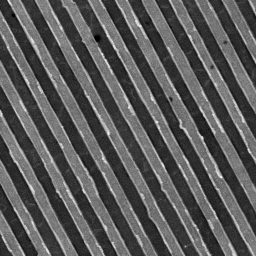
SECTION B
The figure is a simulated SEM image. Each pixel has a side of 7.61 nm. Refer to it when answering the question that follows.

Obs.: parallel lines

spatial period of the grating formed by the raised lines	179	nm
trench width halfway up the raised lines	101	nm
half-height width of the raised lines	10.5	px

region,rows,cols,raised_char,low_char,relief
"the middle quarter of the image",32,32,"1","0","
00111000111000011100001110001110
00111000011100001110001110000111
00011100011100001110000111000111
00011100001110000111000111000011
00001110001110000111000011100011
10001110000111000011100011100001
10000111000111100011100001110001
11000111000011100001110001110000
11000011100001110001110000111000
11100001100001110000111000011000
11100001110000111000011000011100
01110000111000111000011100011110
01110000111000011100001110001110
00111000011100011100001110001111
00011000011100001110000111000111
00011100001100000110000111000111
00001100001110000111000011000011
00001110000110000011000011100001
10000111000111000011100001100001
11000111000011100001110001110000
11000011100011100001110000111000
11100011100001110000111000011000
11100001110000110000111000011100
01110001110000111000011100001100
01111000111000011000011100001110
00111000011000011100001110000111
00111100011100001110001110000111
00011100001110001110000111000011
00011110001110000111000011000011
00001110000110000111000011100001
10001111000111000011100011100001
10000111000011000011100001110000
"